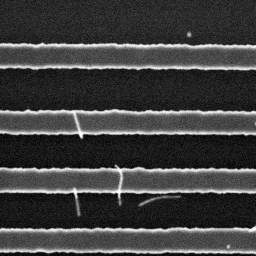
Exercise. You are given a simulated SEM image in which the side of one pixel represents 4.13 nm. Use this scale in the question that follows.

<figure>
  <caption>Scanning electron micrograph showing lines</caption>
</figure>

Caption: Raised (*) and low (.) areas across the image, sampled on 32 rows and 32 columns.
................................
................................
................................
................................
................................
................................
********************************
********************************
....*......**....*.**.**********
................................
................................
................................
................................
................................
********************************
********************************
********************************
................................
................................
................................
................................
********************************
********************************
********************************
................................
................................
................................
................................
................................
********************************
********************************
**.*****************************